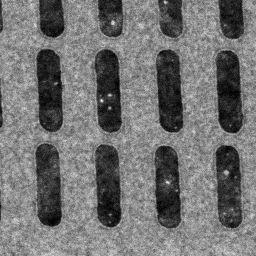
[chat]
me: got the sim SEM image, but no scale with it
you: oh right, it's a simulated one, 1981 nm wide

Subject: a regular array of holes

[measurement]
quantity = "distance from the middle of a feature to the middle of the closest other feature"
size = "460 nm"